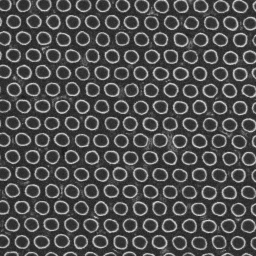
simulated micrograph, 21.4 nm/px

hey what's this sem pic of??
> a regular array of raised bodies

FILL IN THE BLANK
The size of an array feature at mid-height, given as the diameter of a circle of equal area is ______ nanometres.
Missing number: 289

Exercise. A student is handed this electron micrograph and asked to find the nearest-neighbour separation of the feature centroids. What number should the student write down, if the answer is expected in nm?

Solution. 408